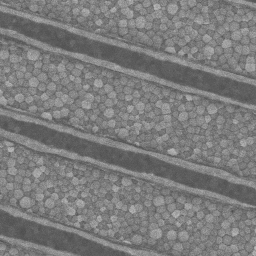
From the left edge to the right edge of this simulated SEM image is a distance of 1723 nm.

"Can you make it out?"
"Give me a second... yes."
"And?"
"one or a few lines or trenches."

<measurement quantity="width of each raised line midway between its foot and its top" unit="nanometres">162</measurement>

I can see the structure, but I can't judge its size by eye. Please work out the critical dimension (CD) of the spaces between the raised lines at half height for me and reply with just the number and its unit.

497 nm